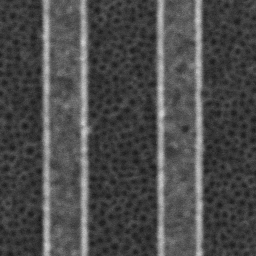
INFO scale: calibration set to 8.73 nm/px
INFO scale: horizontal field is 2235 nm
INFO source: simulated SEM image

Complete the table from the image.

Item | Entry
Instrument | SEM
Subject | one or a few lines or trenches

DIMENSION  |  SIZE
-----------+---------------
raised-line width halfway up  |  333 nm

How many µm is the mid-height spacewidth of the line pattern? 0.666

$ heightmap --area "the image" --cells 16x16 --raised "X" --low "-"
---XX-----XX----
---XX-----XX----
---XX-----XX----
---XX-----XX----
---XX-----XX----
---XX-----XX----
---XX-----XX----
---XX-----XX----
---XX-----XX----
---XX-----XX----
---XX-----XX----
---XX-----XX----
---XX-----XX----
---XX-----XX----
---XX-----XX----
---XX-----XX----